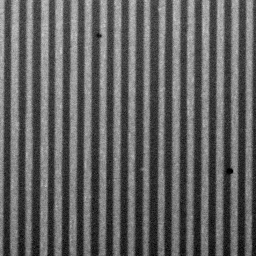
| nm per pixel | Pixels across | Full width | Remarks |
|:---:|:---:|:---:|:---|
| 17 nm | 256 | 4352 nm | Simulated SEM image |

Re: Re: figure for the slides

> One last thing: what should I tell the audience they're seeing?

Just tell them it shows parallel lines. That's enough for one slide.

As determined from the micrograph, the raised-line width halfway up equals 140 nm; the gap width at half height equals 108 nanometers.